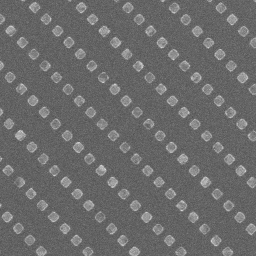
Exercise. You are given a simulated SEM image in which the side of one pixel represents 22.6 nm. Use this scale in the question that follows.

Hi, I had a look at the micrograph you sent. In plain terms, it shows a regular array of raised bodies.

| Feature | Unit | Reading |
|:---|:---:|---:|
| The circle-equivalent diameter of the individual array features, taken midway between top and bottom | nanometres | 206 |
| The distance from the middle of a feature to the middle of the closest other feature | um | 0.365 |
